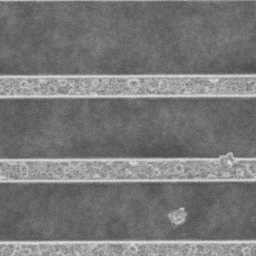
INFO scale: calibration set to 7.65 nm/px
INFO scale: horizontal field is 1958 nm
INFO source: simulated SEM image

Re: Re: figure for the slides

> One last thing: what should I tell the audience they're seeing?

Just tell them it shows one or a few lines or trenches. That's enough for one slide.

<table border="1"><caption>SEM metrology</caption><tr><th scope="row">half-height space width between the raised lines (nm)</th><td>474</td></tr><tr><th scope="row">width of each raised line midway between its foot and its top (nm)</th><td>160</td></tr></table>